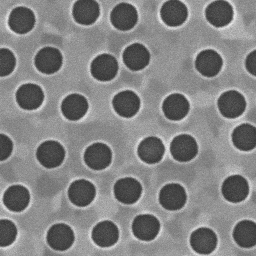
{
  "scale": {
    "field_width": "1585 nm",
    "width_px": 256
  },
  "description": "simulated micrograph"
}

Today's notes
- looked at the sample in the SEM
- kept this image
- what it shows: a regular array of holes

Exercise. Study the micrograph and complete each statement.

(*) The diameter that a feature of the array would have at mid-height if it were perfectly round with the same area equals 181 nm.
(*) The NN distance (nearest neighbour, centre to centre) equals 256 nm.